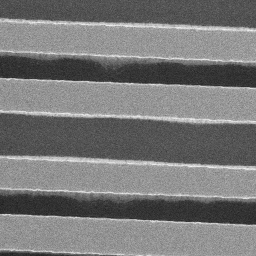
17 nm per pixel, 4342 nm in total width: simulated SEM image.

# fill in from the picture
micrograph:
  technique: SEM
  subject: lines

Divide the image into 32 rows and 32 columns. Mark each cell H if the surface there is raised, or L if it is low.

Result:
LLLLLLLLLLLLLLLLLLLLLLLLLLLLLLLL
LLLLLLLLLLLLLLLLLLLLLLLLLLLLLLLL
LLLLLLLLLLLLLLLLLLLLLLLLLLLLLLLL
HHHHHHHHHHHHHHHHHHHHHHHHLLLLLLLL
HHHHHHHHHHHHHHHHHHHHHHHHHHHHHHHH
HHHHHHHHHHHHHHHHHHHHHHHHHHHHHHHH
LLHHHHHHHHHHHHHHHHHHHHHHHHHHHHHH
LLLLLLLLLLLLLLLLLLLLLLLLLLHHHHHH
LLLLLLLLLLLLLLLLLLLLLLLLLLLLLLLL
LLLLLLLLLLLLLLLLLLLLLLLLLLLLLLLL
HHHHHHHHHHHHHHHHHLLLLLLLLLLLLLLL
HHHHHHHHHHHHHHHHHHHHHHHHHHHHHHHH
HHHHHHHHHHHHHHHHHHHHHHHHHHHHHHHH
HHHHHHHHHHHHHHHHHHHHHHHHHHHHHHHH
LLLLLLLLLLLLLLLLHHHHHHHHHHHHHHHH
LLLLLLLLLLLLLLLLLLLLLLLLLLLLLLLL
LLLLLLLLLLLLLLLLLLLLLLLLLLLLLLLL
LLLLLLLLLLLLLLLLLLLLLLLLLLLLLLLL
LLLLLLLLLLLLLLLLLLLLLLLLLLLLLLLL
LLLLLLLLLLLLLLLLLLLLLLLLLLLLLLLL
HHHHHHHHHHHHHHHHHHLLLLLLLLLLLLLL
HHHHHHHHHHHHHHHHHHHHHHHHHHHHHHHH
HHHHHHHHHHHHHHHHHHHHHHHHHHHHHHHH
HHHHHHHHHHHHHHHHHHHHHHHHHHHHHHHH
LLLLLLLLLLLLLLLLLLLLLLLHHHHHHHHH
LLLLLLLLLLLLLLLLLLLLLLLLLLLLLLLL
LLLLLLLLLLLLLLLLLLLLLLLLLLLLLLLL
HHHHHHHHHHHHHHHHHHLLLLLLLLLLLLLL
HHHHHHHHHHHHHHHHHHHHHHHHHHHHHHHH
HHHHHHHHHHHHHHHHHHHHHHHHHHHHHHHH
HHHHHHHHHHHHHHHHHHHHHHHHHHHHHHHH
LLLLLLHHHHHHHHHHHHHHHHHHHHHHHHHH